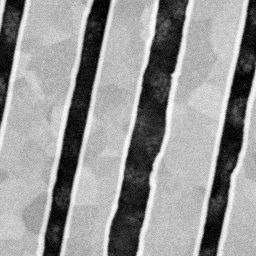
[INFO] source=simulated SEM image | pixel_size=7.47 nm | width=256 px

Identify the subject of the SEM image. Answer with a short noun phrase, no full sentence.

one or a few lines or trenches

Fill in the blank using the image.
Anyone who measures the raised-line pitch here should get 602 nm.